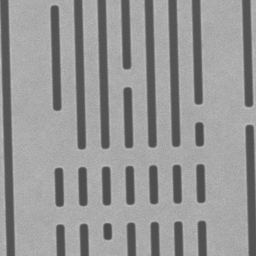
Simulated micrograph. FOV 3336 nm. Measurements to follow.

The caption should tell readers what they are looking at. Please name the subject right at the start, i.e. groups of lines, slits or small figures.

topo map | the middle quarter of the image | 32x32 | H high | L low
HHHLLHHHHLLHHHHLLHHHLLLHHHLLLHHH
HHHLLHHHHLLHHHHHHHHHLLLHHHLLLHHH
HHHLLHHHHLLHHHHHHHHHLLLHHHLLLHHH
HHHLLHHHHLLHHHHHHHHHHLLHHHLLLHHH
HHHLLHHHHLLHHHHHHHHHHLLHHHLLLHHH
HHHLLHHHHLLHHHHHHHHHHLLHHHLLLHHH
HHHLLHHHHLLHHHHLLHHHHLLHHHLLLHHH
HHHLLHHHHLLHHHHLLHHHHLLHHHLLLHHH
HHHLLHHHHLLHHHHLLHHHHLLHHHHLLHHH
HHHLLHHHHLLHHHHLLHHHHLLHHHHLLHHH
HHHLLHHHHLLHHHHLLHHHHLLHHHHLLHHH
HHHLLHHHHLLHHHHLLHHHHLLHHHHLLHHH
HHHLLHHHHLLHHHHLLHHHHLLHHHHLLHHH
HHHLLHHHHLLHHHHLLHHHHLLHHHHLLHHH
HHHLLHHHHLLHHHHLLHHHHLLHHHHLLHHH
HHHLLHHHHLLHHHHLLHHHHLLHHHHLLHHH
HHHLLLHHHLLHHHHLLHHHHLLHHHHLLHHH
HHHLLLHHHLLHHHHLLHHHHLLHHHHLLHHH
HHHLLLHHHLLHHHHLLHHHHLLHHHHLLHHH
HHHLLLHHHLLHHHHLLHHHHLLHHHHLLHHH
HHHLLLHHHLLHHHHLLHHHHLLHHHHLLHHH
HHHHHHHHHHHHHHHHHHHHHHHHHHHHHHHH
HHHHHHHHHHHHHHHHHHHHHHHHHHHHHHHH
HHHHHHHHHHHHHHHHHHHHHHHHHHHHHHHH
HHHHHHHHHHHHHHHHHHHHHHHHHHHHHHHH
HHHHHHHHHHHHHHHHLHHHHHLHHHHLLHHH
HHHHLLHHHHLLHHHLLHHHHLLHHHHLLHHH
HHHLLLHHHLLLHHHLLLHHHLLHHHHLLHHH
HHHLLLHHHLLLHHHLLLHHHLLHHHHLLHHH
HHHLLLHHHHLLHHHLLLHHHLLHHHHLLHHH
HHHLLLHHHHLLHHHLLLHHHLLHHHHLLHHH
HHHLLLHHHHLLHHHLLLHHHLLLHHHLLHHH